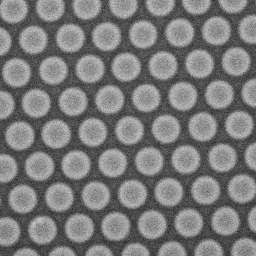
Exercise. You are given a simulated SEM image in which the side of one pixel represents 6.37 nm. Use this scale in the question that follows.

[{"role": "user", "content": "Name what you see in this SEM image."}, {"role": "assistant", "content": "an array of small figures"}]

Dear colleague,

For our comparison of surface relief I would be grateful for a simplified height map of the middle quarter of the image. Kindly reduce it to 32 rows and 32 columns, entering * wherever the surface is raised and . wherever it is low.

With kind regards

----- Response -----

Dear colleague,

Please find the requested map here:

*..*******..*******..*******...*
*..*******..*******..*******...*
*..*******..******....******....
....*****....*****.....***......
......*.........................
...................***.....*****
.***.....*****....*****....*****
*****...*******..*******..******
******..*******..*******..******
******..*******..*******...*****
******..******....*****....*****
*****....*****.....***..........
.***............................
...............**......*****....
.....****.....*****....*****...*
*...******...*******..*******..*
*...******...*******..*******..*
**..*******..*******..*******...
*...******....*****....*****....
*....*****....****......***.....
................................
...........**......****.....****
.****.....*****...******...*****
******...******...*******..*****
******...*******..*******..*****
******...*******..*******..*****
******...******....*****....****
******....****......***.........
..**............................
...............****.....*****...
*....*****....******...******...
**...******...******...*******..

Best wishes